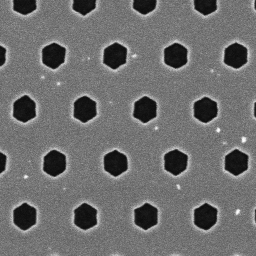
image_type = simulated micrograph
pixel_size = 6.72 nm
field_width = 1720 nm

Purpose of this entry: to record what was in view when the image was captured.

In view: a regular array of holes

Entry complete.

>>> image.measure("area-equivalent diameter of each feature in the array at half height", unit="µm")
0.167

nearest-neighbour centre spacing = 404 nm